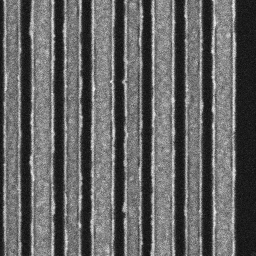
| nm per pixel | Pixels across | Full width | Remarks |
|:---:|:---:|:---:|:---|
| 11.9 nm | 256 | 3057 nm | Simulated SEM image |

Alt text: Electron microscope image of parallel lines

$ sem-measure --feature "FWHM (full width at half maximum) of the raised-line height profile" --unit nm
175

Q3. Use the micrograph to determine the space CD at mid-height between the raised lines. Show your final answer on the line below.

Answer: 0.184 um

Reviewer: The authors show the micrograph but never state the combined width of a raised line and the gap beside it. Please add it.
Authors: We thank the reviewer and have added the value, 361 nanometres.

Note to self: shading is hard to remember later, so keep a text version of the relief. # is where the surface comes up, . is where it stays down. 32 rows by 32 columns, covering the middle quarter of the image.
....###.....###....####....####.
....###.....####...####....####.
....###.....####...####....####.
....###.....###....####....####.
#...###.....###....####....####.
#...###.....###....####....####.
....####....###....####....####.
....###.....###....####....####.
....###.....###....####....####.
....###.....###....####....####.
....###.....###....####....####.
....###.....####...###.....####.
....###.....####...####....####.
....###.....####...###.....####.
....###.....####...###.....####.
#...###.....###....###.....####.
#...###.....####...###.....####.
#...###.....####...###.....####.
#...###.....####...###.....####.
#...###.....####...###.....####.
....###.....###....###.....####.
....###.....###....###.....####.
....###.....####...###.....####.
....###.....####...###.....####.
....###.....####...###.....####.
....###.....####...###.....####.
....###.....###....###.....####.
....###.....###....###.....####.
....###.....###....###.....####.
....###.....###....###.....####.
....###.....####...###.....####.
....###.....###....###.....####.